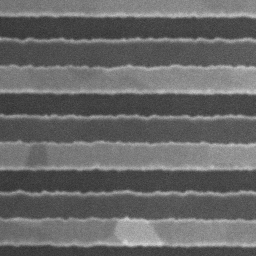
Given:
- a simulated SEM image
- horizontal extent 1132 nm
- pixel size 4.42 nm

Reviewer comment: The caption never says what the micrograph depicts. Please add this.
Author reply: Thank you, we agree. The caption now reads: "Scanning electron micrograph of lines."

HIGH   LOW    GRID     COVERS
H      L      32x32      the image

HHHHHHHHHHHHHHHHHHHHHHHHHHHHHHHH
HHHHHHHHHHHHHHHHHHHHHHHHHHHHHHHH
LLLLLLLLLLLLLLLLLLLLLLLLLLLLLLLL
LLLLLLLLLLLLLLLLLLLLLLLLLLLLLLLL
LLLLLLLLLLLLLLLLLLLLLLLLLLLLLLLL
HHHHHHHHHHHHHHHHHHHHHHHHHHHHHHHH
HHHHHHHHHHHHHHHHHHHHHHHHHHHHHHHH
HHHHHHHHHHHHHHHHHHHHHHHHHHHHHHHH
HHHHHHHHHHHHHHHHHHHHHHHHHHHHHHHH
HHHHHHHHHHHHHHHHHHHHHHHHHHHHHHHH
HHHHHHHHHHHHHHHHHHHHHHHHHHHHHHHH
HHHHHHHHHHHHHHHHHHHHHHHHHHHHHHHH
LLLLLLLLLLLLLLLLLLLLLLLLLLLLLLLL
LLLLLLLLLLLLLLLLLLLLLLLLLLLLLLLL
HLHHLLHLLLLLLLLHLLLLLLLLLLLLHLLL
HHHHHHHHHHHHHHHHHHHHHHHHHHHHHHHH
HHHHHHHHHHHHHHHHHHHHHHHHHHHHHHHH
HHHHHHHHHHHHHHHHHHHHHHHHHHHHHHHH
HHHHHHHHHHHHHHHHHHHHHHHHHHHHHHHH
HHHHHHHHHHHHHHHHHHHHHHHHHHHHHHHH
HHHHHHHHHHHHHHHHHHHHHHHHHHHHHHHH
LLLLLLLLLLLLLLLLLLLLLLLLLLLLLLLL
LLLLLLLLLLLLLLLLLLLLLLLLLLLLLLLL
LLLLLLLLLLLLLLLLLLLLLLLLLLLLLLLL
HHHHHHHHHHHHHHHHHHHHHHHHHHHHHHHH
HHHHHHHHHHHHHHHHHHHHHHHHHHHHHHHH
HHHHHHHHHHHHHHHHHHHHHHHHHHHHHHHH
HHHHHHHHHHHHHHHHHHHHHHHHHHHHHHHH
HHHHHHHHHHHHHHHHHHHHHHHHHHHHHHHH
HHHHHHHHHHHHHHHHHHHHHHHHHHHHHHHH
HHHHHHHHHHHHHHHHHHHHHHHHHHHHHHHH
LLLLLLLLLLLLLLLLLLLLLLLLLLLLLLLL